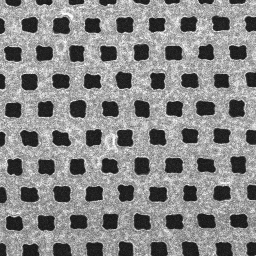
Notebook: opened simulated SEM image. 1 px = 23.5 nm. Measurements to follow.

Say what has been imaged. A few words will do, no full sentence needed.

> a regular array of holes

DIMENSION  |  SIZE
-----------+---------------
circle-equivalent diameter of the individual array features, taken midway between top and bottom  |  408 nm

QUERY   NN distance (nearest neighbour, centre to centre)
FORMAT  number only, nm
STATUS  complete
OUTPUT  739